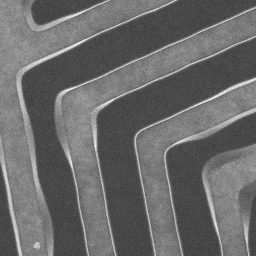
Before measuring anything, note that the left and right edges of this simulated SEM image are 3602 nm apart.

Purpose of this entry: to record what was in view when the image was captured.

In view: groups of lines, slits or small figures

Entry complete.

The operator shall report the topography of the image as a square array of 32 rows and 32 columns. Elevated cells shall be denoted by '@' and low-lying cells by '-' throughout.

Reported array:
---@@@@@@@@@@--------@@@@@@@@@@@
---@@@@@@@--------@@@@@@@@@@@@@-
----@@@@--------@@@@@@@@@@@@@---
--------------@@@@@@@@@@@@------
------------@@@@@@@@@@@@--------
----------@@@@@@@@@@@@-------@@@
-------@@@@@@@@@@@@--------@@@@@
-----@@@@@@@@@@@@--------@@@@@@@
---@@@@@@@@@@@@--------@@@@@@@@@
--@@@@@@@@@@@--------@@@@@@@@@@@
--@@@@@@@@@-------@@@@@@@@@@@@--
---@@@@@--------@@@@@@@@@@@@----
---@@@@-------@@@@@@@@@@@@------
---@@@@-----@@@@@@@@@@@@--------
---@@@@-----@@@@@@@@@@--------@@
---@@@@-----@@@@@@@@--------@@@@
----@@@@----@@@@@@--------@@@@@@
----@@@@----@@@@@------@@@@@@@@@
----@@@@----@@@@@----@@@@@@@@@@@
----@@@@@---@@@@@----@@@@@@@----
----@@@@@---@@@@@----@@@@@@-----
@---@@@@@---@@@@@@---@@@@@------
@----@@@@----@@@@@---@@@@@------
@----@@@@@---@@@@@---@@@@@------
@----@@@@@---@@@@@---@@@@@-----@
@----@@@@@---@@@@@----@@@@-----@
@-----@@@@---@@@@@----@@@@@----@
@@----@@@@---@@@@@@---@@@@@----@
@@----@@@@----@@@@@---@@@@@----@
@@----@@@@@---@@@@@---@@@@@----@
@@----@@@@@---@@@@@---@@@@@@---@
@@@---@@@@@---@@@@@----@@@@@---@